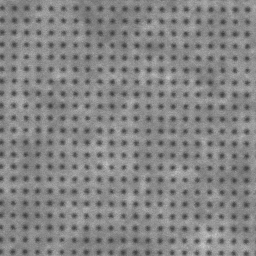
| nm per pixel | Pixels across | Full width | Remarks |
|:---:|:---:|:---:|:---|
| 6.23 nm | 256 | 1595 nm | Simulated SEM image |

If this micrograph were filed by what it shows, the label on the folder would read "a regular array of holes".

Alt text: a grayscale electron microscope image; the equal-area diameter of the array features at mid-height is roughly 32.2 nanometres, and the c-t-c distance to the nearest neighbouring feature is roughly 75.1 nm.